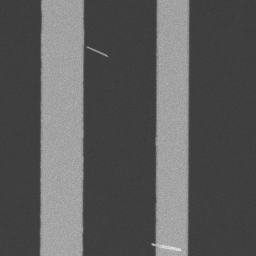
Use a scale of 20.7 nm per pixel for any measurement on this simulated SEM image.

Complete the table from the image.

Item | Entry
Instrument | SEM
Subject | one or a few lines or trenches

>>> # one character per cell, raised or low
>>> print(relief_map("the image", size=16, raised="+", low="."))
+++..+++++..++++
+++..+++++..++++
+++..+++++..++++
+++..+++++..++++
+++..+++++..++++
+++..+++++..++++
+++..+++++..++++
+++..+++++..++++
+++..+++++..++++
+++..+++++..++++
+++..+++++..++++
+++..+++++..++++
+++..+++++..++++
+++..+++++..++++
+++..+++++..++++
+++..+++++..++++